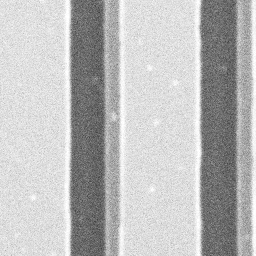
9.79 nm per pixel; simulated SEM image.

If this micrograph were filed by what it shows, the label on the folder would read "lines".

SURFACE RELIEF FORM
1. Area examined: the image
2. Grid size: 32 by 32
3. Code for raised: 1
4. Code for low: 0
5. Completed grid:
11111111100000011111111110000000
11111111100000011111111110000000
11111111100000011111111110000000
11111111100000011111111110000000
11111111100000011111111110000000
11111111100000011111111110000000
11111111100000011111111110000000
11111111100000011111111110000000
11111111100000011111111110000000
11111111100000011111111110000000
11111111100000011111111110000000
11111111100000011111111110000000
11111111100000011111111110000000
11111111100000011111111110000000
11111111100000011111111110000000
11111111100000011111111110000000
11111111100000011111111110000000
11111111100000011111111110000000
11111111100000011111111110000000
11111111100000011111111110000000
11111111100000011111111110000000
11111111100000011111111110000000
11111111100000011111111110000000
11111111100000011111111110000000
11111111100000011111111110000000
11111111100000011111111110000000
11111111100000011111111110000000
11111111100000011111111110000000
11111111100000011111111110000000
11111111100000011111111110000000
11111111100000011111111110000000
11111111100000011111111110000000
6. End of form